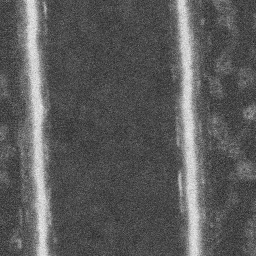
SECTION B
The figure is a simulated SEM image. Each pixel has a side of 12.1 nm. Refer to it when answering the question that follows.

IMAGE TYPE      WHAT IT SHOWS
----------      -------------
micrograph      one or a few lines or trenches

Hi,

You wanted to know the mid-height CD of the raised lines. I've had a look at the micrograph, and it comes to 1.84 um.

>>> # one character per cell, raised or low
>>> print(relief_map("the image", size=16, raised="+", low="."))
..+++++++++.....
..+++++++++.....
..++++++++++....
..++++++++++....
..++++++++++....
..++++++++++....
..++++++++++....
..++++++++++....
..++++++++++....
..++++++++++....
..++++++++++....
...+++++++++....
...+++++++++....
...+++++++++....
...+++++++++....
...+++++++++....